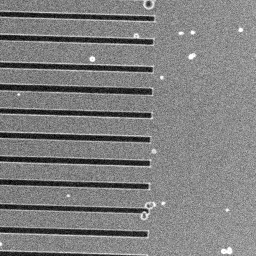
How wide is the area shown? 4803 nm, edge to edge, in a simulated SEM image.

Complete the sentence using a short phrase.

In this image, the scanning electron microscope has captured parallel lines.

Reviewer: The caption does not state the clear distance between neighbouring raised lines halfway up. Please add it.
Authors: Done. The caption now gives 321 nanometres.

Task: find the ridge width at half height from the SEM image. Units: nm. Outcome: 124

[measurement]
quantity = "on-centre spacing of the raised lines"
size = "449 nanometres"